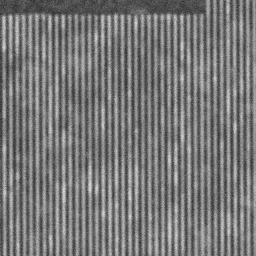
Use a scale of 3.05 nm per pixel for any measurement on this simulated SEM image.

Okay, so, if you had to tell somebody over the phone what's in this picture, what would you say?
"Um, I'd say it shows parallel lines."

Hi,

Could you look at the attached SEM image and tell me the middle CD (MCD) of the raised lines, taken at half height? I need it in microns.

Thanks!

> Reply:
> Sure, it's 0.0065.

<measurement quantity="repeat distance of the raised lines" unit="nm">20.1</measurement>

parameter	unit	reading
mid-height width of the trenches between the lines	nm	13.7